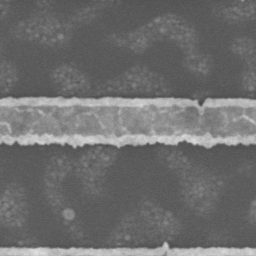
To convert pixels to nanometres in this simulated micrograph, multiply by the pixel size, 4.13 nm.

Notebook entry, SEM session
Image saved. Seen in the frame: one or a few lines or trenches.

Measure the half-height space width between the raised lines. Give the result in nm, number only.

464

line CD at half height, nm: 158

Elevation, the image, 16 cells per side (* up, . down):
................
................
................
................
................
................
************.***
****************
****************
................
................
................
................
................
................
................